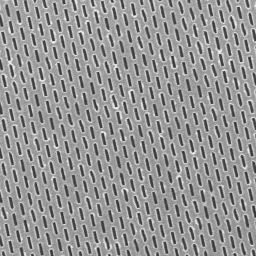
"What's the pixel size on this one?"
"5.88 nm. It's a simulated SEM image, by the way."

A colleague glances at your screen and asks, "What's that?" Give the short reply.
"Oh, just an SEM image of a regular array of holes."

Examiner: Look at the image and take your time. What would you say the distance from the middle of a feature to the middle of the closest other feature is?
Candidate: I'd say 72.6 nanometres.